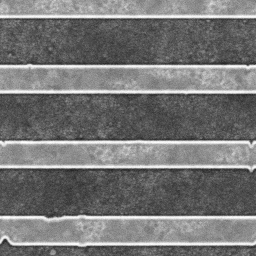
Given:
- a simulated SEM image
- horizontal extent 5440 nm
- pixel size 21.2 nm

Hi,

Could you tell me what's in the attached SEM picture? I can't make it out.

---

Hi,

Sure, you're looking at one or a few lines or trenches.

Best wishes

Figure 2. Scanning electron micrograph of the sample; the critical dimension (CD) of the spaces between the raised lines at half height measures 1.08 µm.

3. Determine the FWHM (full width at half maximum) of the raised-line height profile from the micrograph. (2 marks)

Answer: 547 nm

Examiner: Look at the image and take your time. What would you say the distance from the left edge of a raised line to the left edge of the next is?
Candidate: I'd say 1610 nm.